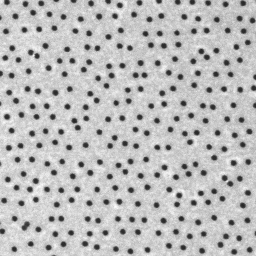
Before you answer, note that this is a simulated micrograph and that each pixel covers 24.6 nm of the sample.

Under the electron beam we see a regular array of holes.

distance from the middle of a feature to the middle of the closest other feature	308	nm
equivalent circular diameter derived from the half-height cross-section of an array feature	149	nm